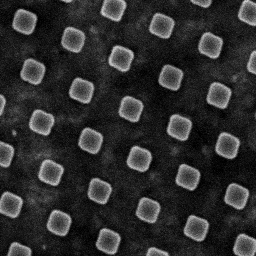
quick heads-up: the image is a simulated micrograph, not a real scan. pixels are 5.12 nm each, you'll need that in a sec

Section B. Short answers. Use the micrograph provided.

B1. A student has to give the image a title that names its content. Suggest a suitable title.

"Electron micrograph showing a regular array of raised bodies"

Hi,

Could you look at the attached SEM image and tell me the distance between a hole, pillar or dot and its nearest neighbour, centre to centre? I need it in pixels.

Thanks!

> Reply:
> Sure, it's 50.8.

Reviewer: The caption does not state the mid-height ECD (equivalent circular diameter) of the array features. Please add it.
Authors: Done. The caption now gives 119 nm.